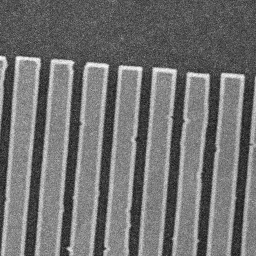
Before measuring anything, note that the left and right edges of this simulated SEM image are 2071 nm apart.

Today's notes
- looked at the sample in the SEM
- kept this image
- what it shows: parallel lines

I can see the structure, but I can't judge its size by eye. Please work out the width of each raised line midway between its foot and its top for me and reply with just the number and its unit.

0.162 microns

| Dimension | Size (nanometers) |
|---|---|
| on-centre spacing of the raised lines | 276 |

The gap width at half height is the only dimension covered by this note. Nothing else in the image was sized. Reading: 116 nm